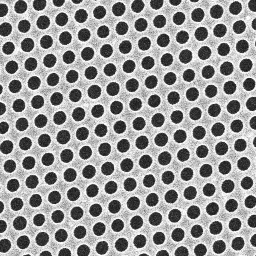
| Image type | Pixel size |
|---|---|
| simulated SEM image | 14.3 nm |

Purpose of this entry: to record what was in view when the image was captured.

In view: a regular array of holes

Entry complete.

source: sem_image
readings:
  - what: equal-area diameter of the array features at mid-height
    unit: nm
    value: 197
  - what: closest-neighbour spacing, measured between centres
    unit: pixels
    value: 19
